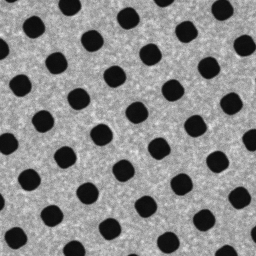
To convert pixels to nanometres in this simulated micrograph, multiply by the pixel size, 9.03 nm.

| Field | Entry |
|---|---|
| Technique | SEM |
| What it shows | a regular array of holes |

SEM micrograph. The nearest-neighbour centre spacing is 380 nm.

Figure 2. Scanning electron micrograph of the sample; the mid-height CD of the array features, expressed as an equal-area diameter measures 200 nanometres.